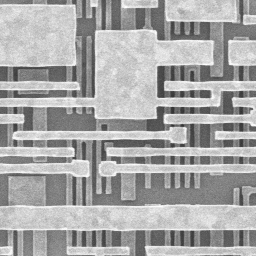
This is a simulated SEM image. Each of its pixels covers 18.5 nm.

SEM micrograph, wiring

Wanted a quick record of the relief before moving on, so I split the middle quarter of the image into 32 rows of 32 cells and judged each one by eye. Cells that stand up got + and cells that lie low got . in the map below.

........++++++++++++++++........
........+++++++++++++++.........
........+++++++++++++++.........
........+++++++++++++++.........
........+++++++++++++++..+++++..
++++....+++++++++++++++..+++++++
........+++++++++++++++..++++++.
........+++++++++++++++.........
++++++.+++++++++++++++++..++++++
++++++++++++++++++++++++++++++++
++++++++++++++++++++++++++++++++
........+++++++++++++++.........
........+++++++++++++++.........
........+++++++++++++++..+++++++
.........................+++++++
................................
..........................+++++.
+++++++++++++++++++++++++++++++.
+++++++++++++++++++++++++++++++.
...........................++++.
................................
++.........+++++++++++++++++++++
++.........+++++++++++++++++++++
................................
..++++...++++...................
++++++...+++++++++++++++++++++++
++++++...+++++++++++++++++++++++
..++++...++++...................
................................
................................
................................
................................